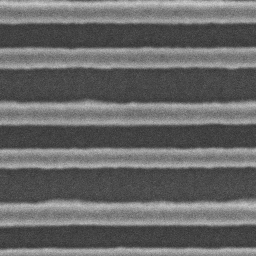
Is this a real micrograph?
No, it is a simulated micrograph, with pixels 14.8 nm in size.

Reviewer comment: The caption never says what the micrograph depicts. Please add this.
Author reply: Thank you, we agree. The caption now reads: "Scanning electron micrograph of lines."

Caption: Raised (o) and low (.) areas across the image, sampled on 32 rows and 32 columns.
oo..ooooo...ooooooooo.oooooooooo
oooooooooooooooooooooooooooooooo
oooooooooooooooooooooooooooooooo
................................
................................
................................
oooooooooooooooooooooooooooooooo
oooooooooooooooooooooooooooooooo
................................
................................
................................
................................
................................
oooooooooooooooooooooooooooooooo
oooooooooooooooooooooooooooooooo
oo..........o..oo...............
................................
................................
................................
oooooooooooooooooooooooooooooooo
oooooooooooooooooooooooooooooooo
................................
................................
................................
................................
................................
oooooooooooooooooooooooooooooooo
oooooooooooooooooooooooooooooooo
................................
................................
................................
oooooooooooooooooooooooooooooooo